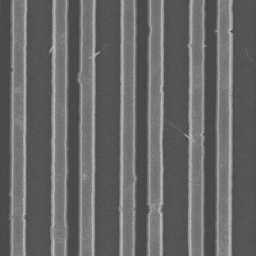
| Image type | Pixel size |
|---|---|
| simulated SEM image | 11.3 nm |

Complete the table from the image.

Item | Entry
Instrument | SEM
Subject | parallel lines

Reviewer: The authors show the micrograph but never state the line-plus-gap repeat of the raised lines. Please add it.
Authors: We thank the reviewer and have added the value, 386 nm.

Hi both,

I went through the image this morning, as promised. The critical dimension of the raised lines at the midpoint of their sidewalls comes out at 0.158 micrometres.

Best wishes